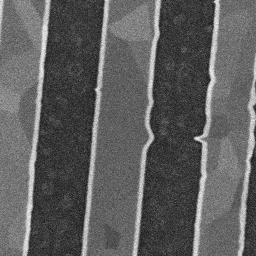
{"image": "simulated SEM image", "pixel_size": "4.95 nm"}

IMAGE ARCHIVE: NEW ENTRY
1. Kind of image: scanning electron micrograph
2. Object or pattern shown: one or a few lines or trenches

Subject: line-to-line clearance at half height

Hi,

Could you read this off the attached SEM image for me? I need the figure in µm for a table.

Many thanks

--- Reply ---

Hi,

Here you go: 0.291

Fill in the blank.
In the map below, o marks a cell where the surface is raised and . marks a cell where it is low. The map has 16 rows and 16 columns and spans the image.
ooo....ooo....oo
ooo....ooo....oo
ooo...oooo...ooo
ooo...oooo...ooo
ooo...ooo....ooo
ooo...ooo....ooo
oo....ooo....ooo
oo....ooo....ooo
oo....ooo....ooo
oo....ooo....ooo
oo....ooo....ooo
oo....ooo....oo.
oo....ooo....oo.
oo...oooo...ooo.
oo...oooo...ooo.
oo...ooo....ooo.